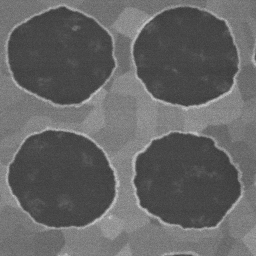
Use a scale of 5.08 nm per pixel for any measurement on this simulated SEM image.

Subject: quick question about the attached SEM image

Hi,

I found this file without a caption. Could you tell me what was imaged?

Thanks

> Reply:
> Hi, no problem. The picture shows holes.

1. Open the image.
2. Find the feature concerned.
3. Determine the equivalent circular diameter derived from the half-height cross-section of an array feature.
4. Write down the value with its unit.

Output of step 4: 518 nm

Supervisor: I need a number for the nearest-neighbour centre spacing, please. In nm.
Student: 629